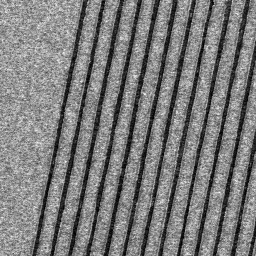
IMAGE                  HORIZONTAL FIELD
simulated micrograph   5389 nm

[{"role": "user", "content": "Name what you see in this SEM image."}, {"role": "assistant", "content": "parallel lines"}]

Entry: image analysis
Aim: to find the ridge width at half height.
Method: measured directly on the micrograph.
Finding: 268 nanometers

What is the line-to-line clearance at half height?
0.101 microns